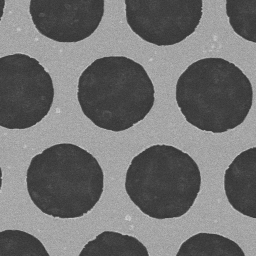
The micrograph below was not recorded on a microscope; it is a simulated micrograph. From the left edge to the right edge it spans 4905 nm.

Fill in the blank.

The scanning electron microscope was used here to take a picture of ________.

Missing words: holes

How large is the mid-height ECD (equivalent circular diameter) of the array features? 1450 nanometers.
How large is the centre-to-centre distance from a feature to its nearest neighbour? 1.89 um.